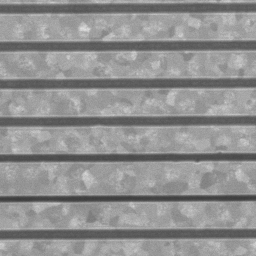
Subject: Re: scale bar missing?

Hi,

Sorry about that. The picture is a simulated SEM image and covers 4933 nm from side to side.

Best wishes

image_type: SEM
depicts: parallel lines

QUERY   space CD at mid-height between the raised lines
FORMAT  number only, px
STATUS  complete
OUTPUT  9.5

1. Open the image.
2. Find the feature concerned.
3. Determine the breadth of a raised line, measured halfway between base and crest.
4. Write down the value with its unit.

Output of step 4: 547 nanometers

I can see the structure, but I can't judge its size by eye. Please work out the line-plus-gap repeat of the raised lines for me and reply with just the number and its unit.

725 nm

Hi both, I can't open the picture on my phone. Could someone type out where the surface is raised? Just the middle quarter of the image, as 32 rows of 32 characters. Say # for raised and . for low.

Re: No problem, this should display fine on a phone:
################################
################################
################################
##################..............
................................
................................
################################
################################
################################
################################
################################
################################
################################
................................
................................
.......###......................
################################
################################
################################
################################
################################
################################
###########.....................
................................
####.......#####...#############
################################
################################
################################
################################
################################
################################
################################